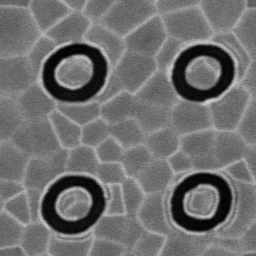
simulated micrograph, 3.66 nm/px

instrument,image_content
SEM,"ring-shaped grooves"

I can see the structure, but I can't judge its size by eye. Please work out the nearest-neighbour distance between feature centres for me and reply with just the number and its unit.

468 nanometers